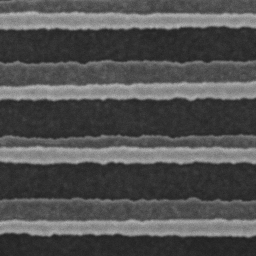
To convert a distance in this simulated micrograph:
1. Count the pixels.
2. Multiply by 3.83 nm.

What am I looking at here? lines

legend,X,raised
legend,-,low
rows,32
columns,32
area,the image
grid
XXXXXXXXXXXXXXXXXXXXXXXXXXXXXXXX
XXXXXXXXXXXXXXXXXXXXXXXXXXXXXXXX
XXXXXXXXXXXXXXXXXXXXXXXXXXXXXXXX
XXXXX-XXXXXXXXXX-X--XX----------
--------------------------------
--------------------------------
--------------------------------
--------------------------------
XXXXXXXXXXXXXXXXXXXXXXXXXXXXXXXX
XXXXXXXXXXXXXXXXXXXXXXXXXXXXXXXX
XXXXXXXXXXXXXXXXXXXXXXXXXXXXXXXX
XXXXXXXXXXXXXXXXXXXXXXXXXXXXXXXX
----X-X-------------------------
--------------------------------
--------------------------------
--------------------------------
--------------------------------
XXXXXXXXXXXXXXXXXXXXXXXXXXXXXXXX
XXXXXXXXXXXXXXXXXXXXXXXXXXXXXXXX
XXXXXXXXXXXXXXXXXXXXXXXXXXXXXXXX
-----X--------------------------
--------------------------------
--------------------------------
--------------------------------
--------------------------------
XXXXXXXXXXXXXXXXXXXXXXXXXXXXXXXX
XXXXXXXXXXXXXXXXXXXXXXXXXXXXXXXX
XXXXXXXXXXXXXXXXXXXXXXXXXXXXXXXX
XXXXXXXXXXXXXXXXXXXXXXXXXXXXXXXX
-----X----------X--XX-XXXXXXXXXX
--------------------------------
--------------------------------